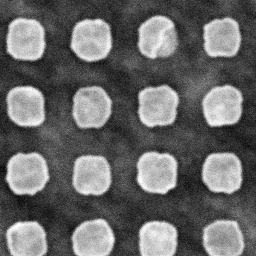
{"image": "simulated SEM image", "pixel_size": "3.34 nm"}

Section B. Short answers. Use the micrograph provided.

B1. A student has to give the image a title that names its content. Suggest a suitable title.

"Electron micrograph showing a regular array of raised bodies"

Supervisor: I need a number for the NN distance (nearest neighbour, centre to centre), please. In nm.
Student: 217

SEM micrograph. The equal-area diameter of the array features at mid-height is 132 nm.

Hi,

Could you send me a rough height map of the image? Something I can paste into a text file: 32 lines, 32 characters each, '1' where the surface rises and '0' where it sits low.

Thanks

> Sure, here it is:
00000000000000000000000000000000
00000000000000000000000000000000
00100000000000000001100000011000
01111000011111000011100000111100
01111000011111000011000000111100
01111000011111000111000000111100
01111000011110000010000000111000
00000000000100000000000000000000
00000000000000000000000000000000
00000000000000000000000000000000
00000000000000000000000000000000
01111000001110000011110000111100
01111001011111000111110000111100
01111000011111000111110001111100
01111100011111000011110000111100
00110000001110000011000000110000
00000000000000000000000000000000
00000000000000000000000000000000
00000000000000000000000000000000
00111000000000000011100000111000
01111100011110000111110000111100
01111100011111000111110001111100
01111100011111000111110000111100
00111000011110000011100000111100
00000000000000000000000000000000
00000000000000000000000000000000
00000000000000000000000000000000
00000000000010000000000000000000
01111000001111000011110000111100
01111100011111000011110000111100
01111100011111000011110000111100
01111100011111000011110000111100